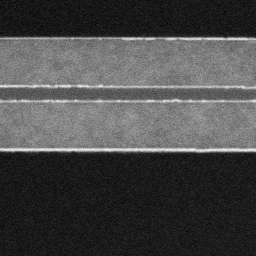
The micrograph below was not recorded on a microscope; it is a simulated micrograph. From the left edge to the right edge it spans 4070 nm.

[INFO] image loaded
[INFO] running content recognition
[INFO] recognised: lines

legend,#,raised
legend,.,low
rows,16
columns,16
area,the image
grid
################
################
................
................
................
................
................
................
................
################
################
################
################
################
################
################